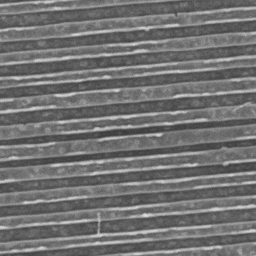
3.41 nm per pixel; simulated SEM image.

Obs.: parallel lines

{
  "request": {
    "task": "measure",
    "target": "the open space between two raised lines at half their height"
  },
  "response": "40.3 nanometres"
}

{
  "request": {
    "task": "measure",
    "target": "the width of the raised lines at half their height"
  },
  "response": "43.2 nanometres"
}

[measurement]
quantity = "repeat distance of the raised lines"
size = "80.4 nm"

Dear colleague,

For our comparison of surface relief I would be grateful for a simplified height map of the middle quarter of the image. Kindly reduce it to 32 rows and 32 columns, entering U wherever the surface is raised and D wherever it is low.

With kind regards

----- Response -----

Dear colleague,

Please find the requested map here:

DDDDDDDDDDDDDDDDDDUUUUUUUUUUUUUU
DDDDDDDUUUUUUUUUUUUUUUUUUUUUUUUU
UUUUUUUUUUUUUUUUUUUUUUUDDDDDDDDD
UUUUUUUUUUUUUDDDDDDDDDDDDDDDDDDD
DUDDDDDDDDDDDDDDDDDDDDDDDDDDDDDD
DDDDDDDDDDDDDDDDDDDDDDDDDUUUUUUU
DDDDDDDDDDDUUUUUUUUUUUUUUUUUUUUU
UUUUUUUUUUUUUUUUUUUUUUUUUUUUUUUU
UUUUUUUUUUUUUUUUUUUUUUUUUUUDDDDD
UUUUUUUUUUUUUUUUDDDDDDDDDDDDDDDD
UUUUUDDDDDDDDDDDDDDDDDDDDDDDDDDD
DDDDDDDDDDDDDDDDDDDDDDDDDDDDDDDD
DDDDDDDDDDDDDDDDDDDDUUUUUUUUUUUU
DDDDDDDDDUUUUUUUUUUUUUUUUUUUUUUU
UUUUUUUUUUUUUUUUUUUUUUUUUUUUUUUU
UUUUUUUUUUUUUUUUUUUUUUDDDDDDDDDD
UUUUUUUUUUUDDDDDDDDDDDDDDDDDDDDU
DDDDDDDDDDDDDDDDDDDDDDUUUUUUUUUU
DDDDDDDDDDUUUUUUUUUUUUUUUUUUUUUU
DUUUUUUUUUUUUUUUUUUUUUUUUUUUUUUU
UUUUUUUUUUUUUUUUUUUUUUUUUUUDDDDD
UUUUUUUUUUUUUUUDDDDDDDDDDDDDDDDD
UUUUDDDDDDDDDDDDDDDDDDDDDDDDUUUU
DDDDDDDDDDDDDDDDDUUUUUUUUUUUUUUU
DDDDDUUUUUUUUUUUUUUUUUUUUUUUUUUU
UUUUUUUUUUUUUUUUUUUUUUUUUUUUUUUU
UUUUUUUUUUUUUUUUUUUDDDDDDDDDDDDD
UUUUUUUUUDDDDDDDDDDDDDDDDDDDDDDD
DDDDDDDDDDDDDDDDDDDDDDDDDDDDDDUU
DDDDDDDDDDDDDDDDDDDDDUUUUUUUUUUU
DDDDDDDUUUUUUUUUUUUUUUUUUUUUUUUU
UUUUUUUUUUUUUUUUUUUUUUUUUUUUUUDD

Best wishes